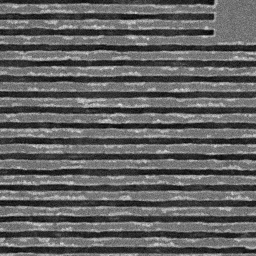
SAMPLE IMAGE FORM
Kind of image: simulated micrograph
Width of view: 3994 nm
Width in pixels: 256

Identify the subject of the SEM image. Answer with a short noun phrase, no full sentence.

parallel lines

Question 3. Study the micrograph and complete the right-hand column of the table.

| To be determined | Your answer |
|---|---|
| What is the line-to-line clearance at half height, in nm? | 107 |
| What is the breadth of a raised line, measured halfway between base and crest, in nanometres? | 138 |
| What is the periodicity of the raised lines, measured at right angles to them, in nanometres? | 242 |